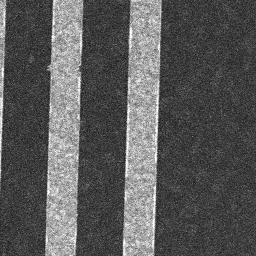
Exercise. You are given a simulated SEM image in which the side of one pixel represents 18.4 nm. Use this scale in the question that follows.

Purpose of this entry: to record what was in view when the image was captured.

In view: one or a few lines or trenches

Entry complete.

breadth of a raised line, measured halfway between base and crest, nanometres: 554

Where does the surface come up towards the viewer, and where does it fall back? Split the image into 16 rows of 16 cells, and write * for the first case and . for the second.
...**...**......
...**...**......
...**...**......
...**...**......
...**...**......
...**...**......
...**...**......
...**...**......
...**...**......
...**...**......
...**...**......
...**...**......
...**...**......
...**...**......
...**...**......
...**...**......